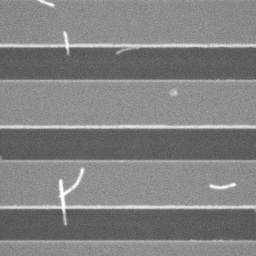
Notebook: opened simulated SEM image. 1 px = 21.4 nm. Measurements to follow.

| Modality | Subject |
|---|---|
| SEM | lines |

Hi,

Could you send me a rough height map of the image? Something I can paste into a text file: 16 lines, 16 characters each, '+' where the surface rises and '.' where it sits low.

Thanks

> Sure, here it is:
++++++++++++++++
++++++++++++++++
++++++++++++++++
................
................
++++++++++++++++
++++++++++++++++
++++++++++++++++
................
................
++++++++++++++++
++++++++++++++++
++++++++++++++++
................
................
++++++++++++++++